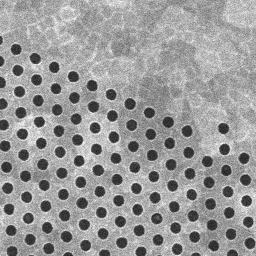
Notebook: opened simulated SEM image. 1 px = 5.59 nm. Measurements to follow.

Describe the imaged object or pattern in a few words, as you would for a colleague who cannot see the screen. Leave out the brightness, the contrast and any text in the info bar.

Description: a regular array of holes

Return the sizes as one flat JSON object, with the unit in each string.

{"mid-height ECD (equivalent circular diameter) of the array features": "65.6 nm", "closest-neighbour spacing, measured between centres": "116 nm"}